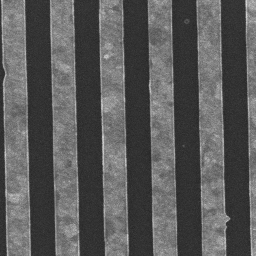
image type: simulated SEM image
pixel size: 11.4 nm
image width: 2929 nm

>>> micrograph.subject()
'parallel lines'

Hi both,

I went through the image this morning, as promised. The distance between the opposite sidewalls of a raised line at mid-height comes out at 0.262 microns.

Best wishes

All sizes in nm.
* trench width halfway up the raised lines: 292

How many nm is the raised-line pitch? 559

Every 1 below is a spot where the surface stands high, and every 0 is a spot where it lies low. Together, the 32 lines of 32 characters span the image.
11100011100001100001100001100001
11100011100001100001100001100001
11100011100001100001100001100001
11100011100011100001100001110001
11100011100001100001100001110001
11100011100001100001100001110001
11100001100001100001110001110001
11100001100001100001110001110001
01100001100001100001110001110001
01100001100001100001110001110001
11100001100001100001110001110001
11100001100001110001110001110001
01100001100001110001110001110001
01100001100001110001110001110001
01100001100001110001110001110001
01100001100001110001110001110001
01100001100001110001110001110001
01100001110001110001110001110001
01100001110001110001110001110001
01100001110001110001110001110001
01100001110001110001110001110001
01100001110001110001110001110001
01100001110001110001110001110001
01110001110001110001110001110001
01110001110001110001110001110001
01110001110001110001110001110001
01110001110001110001110001110001
01110001110001110001110001110001
01110001110001110001110001110001
01110001110001110001110001110001
01110001110001110001110001110001
01110001110001110001110001110000